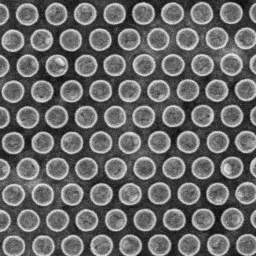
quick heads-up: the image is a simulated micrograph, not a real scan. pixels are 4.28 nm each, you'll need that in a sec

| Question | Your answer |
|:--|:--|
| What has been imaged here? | a regular array of raised bodies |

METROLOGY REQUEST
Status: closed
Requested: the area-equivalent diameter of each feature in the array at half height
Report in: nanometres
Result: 92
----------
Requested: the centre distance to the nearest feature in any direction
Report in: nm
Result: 124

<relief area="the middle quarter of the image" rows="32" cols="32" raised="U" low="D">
UDDUUUUUDDUUUUUDDUUUUUUDDUUUUUDD
UDDUUUUUDDUUUUUDDDUUUUDDDUUUUUDD
DDDDUUUDDDDUUUDDDDDUUDDDDDUUUDDD
DDDDDDDDDDDDDDDDDDDDDDDDDDDDDDDD
DUUDDDDDUUDDDDDUUUDDDDUUUDDDDUUU
UUUUDDDUUUUDDDUUUUUDDUUUUUDDDUUU
UUUUDDDUUUUUDDUUUUUDDUUUUUDDUUUU
UUUUDDDUUUUUDDUUUUUDDUUUUUDDUUUU
UUUUDDDUUUUDDDUUUUDDDDUUUUDDDUUU
DDDDDDDDDDDDDDDDDDDDDDDDDDDDDDDD
DDDDDDDDDDDDDDDDDDDDDDDDDDDDDDDD
DDDDUUUDDDDUUUUDDDUUUUDDDUUUUDDD
UDDUUUUUDDUUUUUDDUUUUUUDDUUUUUDD
UDDUUUUUDDUUUUUDDUUUUUUDDUUUUUDD
DDDUUUUUDDDUUUUDDDUUUUDDDUUUUUDD
DDDDUUUDDDDDUUDDDDDUUDDDDDUUDDDD
DDDDDDDDDDDDDDDDDDDDDDDDDDDDDDDD
DUUDDDDDUUUDDDDUUUDDDDUUUDDDDUUU
UUUUDDDUUUUDDDUUUUUDDUUUUUDDDUUU
UUUUDDDUUUUUDDUUUUUDDUUUUUDDUUUU
UUUUDDDUUUUUDDUUUUUDDUUUUUDDUUUU
UUUUDDDUUUUDDDUUUUDDDDUUUUDDDUUU
DDDDDDDDDDDDDDDDDDDDDDDDDDDDDDDD
DDDDDDDDDDDDDDDDDDDUUDDDDDDUDDDD
DDDDUUUUDDDUUUUDDDUUUUDDDUUUUUDD
UDDUUUUUDDUUUUUDDDUUUUUDDUUUUUDD
UDDUUUUUDDUUUDUUDDUUUUUDDUUUUUDD
UDDUUUUUDDDUUUUDDDUUUUDDDUUUUUDD
DDDDUUUDDDDDUUDDDDDUUDDDDDDUDDDD
DDDDDDDDDDDDDDDDDDDDDDDDDDDDDDDD
UUUUDDDDUUUDDDDUUUDDDDUUUUDDDUUU
UUUUDDDUUUUUDDUUUUUDDUUUUUDDDUUU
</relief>